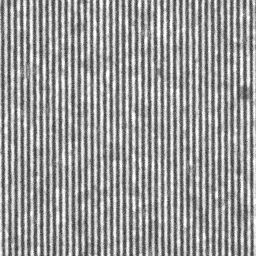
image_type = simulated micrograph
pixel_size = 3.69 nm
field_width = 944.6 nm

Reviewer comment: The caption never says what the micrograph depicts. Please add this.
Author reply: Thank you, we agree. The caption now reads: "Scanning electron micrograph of parallel lines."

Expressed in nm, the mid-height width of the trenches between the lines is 16.1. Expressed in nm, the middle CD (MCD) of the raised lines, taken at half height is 7.8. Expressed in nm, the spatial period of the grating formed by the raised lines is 23.5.